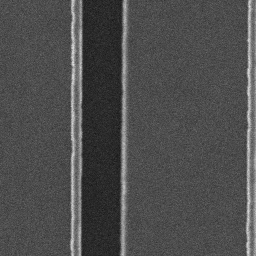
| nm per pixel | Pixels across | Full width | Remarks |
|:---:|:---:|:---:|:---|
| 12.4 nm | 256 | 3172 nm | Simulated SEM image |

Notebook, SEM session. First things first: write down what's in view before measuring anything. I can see lines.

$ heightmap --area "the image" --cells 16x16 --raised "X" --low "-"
XXXXX---XXXXXXXX
XXXXX---XXXXXXXX
XXXXX---XXXXXXXX
XXXXX---XXXXXXXX
XXXXX---XXXXXXXX
XXXXX---XXXXXXXX
XXXXX---XXXXXXXX
XXXXX---XXXXXXXX
XXXXX---XXXXXXXX
XXXXX---XXXXXXXX
XXXXX---XXXXXXXX
XXXXX---XXXXXXXX
XXXXX---XXXXXXXX
XXXXX---XXXXXXXX
XXXXX---XXXXXXXX
XXXXX---XXXXXXXX